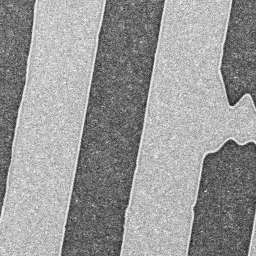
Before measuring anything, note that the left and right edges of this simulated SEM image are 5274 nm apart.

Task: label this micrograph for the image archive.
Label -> one or a few lines or trenches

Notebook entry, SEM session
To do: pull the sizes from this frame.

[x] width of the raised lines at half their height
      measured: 1330 nm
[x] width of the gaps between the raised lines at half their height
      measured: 1230 nanometres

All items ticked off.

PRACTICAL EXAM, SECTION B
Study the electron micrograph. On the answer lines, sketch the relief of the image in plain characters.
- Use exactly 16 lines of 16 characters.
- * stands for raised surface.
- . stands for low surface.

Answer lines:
..****....****..
..****....****..
..****....****..
..****....****..
..****....****..
..****...*****..
.****....*******
.****....*******
.****....*******
.****....****...
.****....****...
****....****....
****....****....
****....****....
****....****....
****....****....